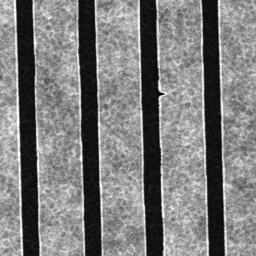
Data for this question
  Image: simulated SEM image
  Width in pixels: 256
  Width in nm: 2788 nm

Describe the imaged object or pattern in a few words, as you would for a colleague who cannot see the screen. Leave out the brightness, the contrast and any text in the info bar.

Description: one or a few lines or trenches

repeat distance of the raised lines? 673 nanometres